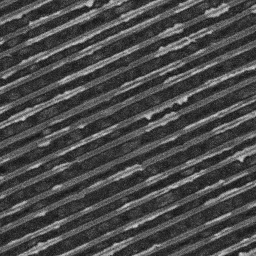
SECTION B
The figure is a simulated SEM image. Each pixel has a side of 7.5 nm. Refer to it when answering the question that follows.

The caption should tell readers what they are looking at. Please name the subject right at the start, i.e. parallel lines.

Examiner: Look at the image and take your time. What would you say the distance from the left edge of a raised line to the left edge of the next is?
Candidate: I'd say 119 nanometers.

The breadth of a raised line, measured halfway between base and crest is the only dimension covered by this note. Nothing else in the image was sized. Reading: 35.8 nanometres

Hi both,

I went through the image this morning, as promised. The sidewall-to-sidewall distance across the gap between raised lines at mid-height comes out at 70.8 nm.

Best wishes